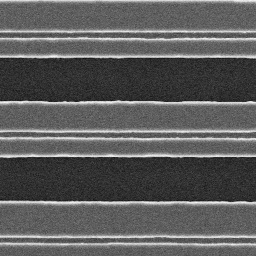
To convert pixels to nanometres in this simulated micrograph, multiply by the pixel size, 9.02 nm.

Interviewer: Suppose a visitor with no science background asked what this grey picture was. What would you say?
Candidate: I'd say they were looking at lines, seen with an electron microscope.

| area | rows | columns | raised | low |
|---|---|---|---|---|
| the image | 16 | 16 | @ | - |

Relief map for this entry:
@@@@@@@@@@@@@@@@
@@@@@@@@@@@@@@@@
@@@@@@@@@@@@@@@@
@@@@@@@@@@@@@@@@
----------------
----------------
@@@@@@@@@@@@@@@@
@@@@@@@@@@@@@@@@
@@@@@@@@@@@@@@@@
@@@@@@@@@@@@@@@@
----------------
----------------
----------------
@@@@@@@@@@@@@@@@
@@@@@@@@@@@@@@@@
@@@@@@@@@@@@@@@@